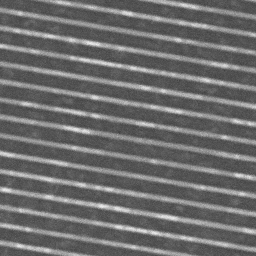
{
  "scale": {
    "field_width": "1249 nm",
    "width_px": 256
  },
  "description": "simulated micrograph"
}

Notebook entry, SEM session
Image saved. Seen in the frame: parallel lines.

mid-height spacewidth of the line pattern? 0.0697 micrometres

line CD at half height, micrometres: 0.0174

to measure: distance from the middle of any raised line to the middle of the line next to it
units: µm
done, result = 0.0861